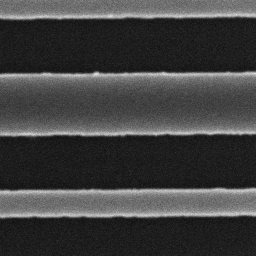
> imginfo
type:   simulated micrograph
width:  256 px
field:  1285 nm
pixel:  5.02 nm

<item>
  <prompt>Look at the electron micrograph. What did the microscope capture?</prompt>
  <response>lines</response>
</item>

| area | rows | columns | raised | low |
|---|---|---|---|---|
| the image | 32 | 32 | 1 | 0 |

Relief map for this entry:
11111111111111111111111111111111
11111111111111111111111111111111
00000000000000000000000000000000
00000000000000000000000000000000
00000000000000000000000000000000
00000000000000000000000000000000
00000000000000000000000000000000
00000000000000000000000000000000
00000000000000000000000000000000
11111111111111111111111111111111
11111111111111111111111111111111
11111111111111111111111111111111
11111111111111111111111111111111
11111111111111111111111111111111
11111111111111111111111111111111
11111111111111111111111111111111
11111111111111111111111111111111
00000000000000000000000000000000
00000000000000000000000000000000
00000000000000000000000000000000
00000000000000000000000000000000
00000000000000000000000000000000
00000000000000000000000000000000
00000000000000000000000000000000
11111111111111111111111111111111
11111111111111111111111111111111
11111111111111111111111111111111
00000000000000000000000000000000
00000000000000000000000000000000
00000000000000000000000000000000
00000000000000000000000000000000
00000000000000000000000000000000